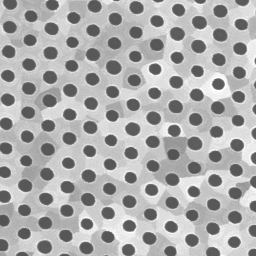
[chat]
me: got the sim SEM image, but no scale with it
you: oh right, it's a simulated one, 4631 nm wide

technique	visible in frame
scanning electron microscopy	a regular array of holes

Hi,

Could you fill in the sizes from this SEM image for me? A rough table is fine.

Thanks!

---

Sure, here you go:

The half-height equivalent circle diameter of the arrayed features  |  224 nanometers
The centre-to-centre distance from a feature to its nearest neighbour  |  23.8 pixels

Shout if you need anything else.